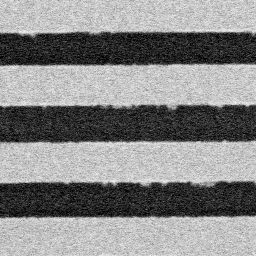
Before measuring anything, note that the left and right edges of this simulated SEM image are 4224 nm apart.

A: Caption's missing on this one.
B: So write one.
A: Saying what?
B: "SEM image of lines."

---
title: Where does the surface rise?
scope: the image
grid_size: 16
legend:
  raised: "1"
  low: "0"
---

1111111111111111
1111111111111111
0000000000000000
0000000000000000
1111111111111111
1111111111111111
1111110000000000
0000000000000000
0000000000000000
1111111111111111
1111111111111111
0000000000000000
0000000000000000
0000000000000000
1111111111111111
1111111111111111